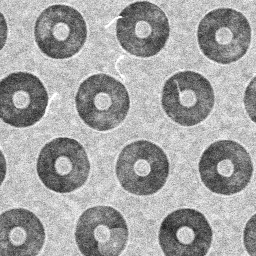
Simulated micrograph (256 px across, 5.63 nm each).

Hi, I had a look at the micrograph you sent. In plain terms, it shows a regular array of ring-shaped grooves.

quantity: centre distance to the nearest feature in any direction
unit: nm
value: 426